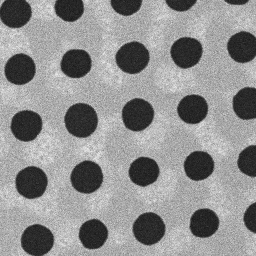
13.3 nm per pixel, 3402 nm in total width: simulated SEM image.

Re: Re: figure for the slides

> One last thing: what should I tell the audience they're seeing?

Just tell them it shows a regular array of holes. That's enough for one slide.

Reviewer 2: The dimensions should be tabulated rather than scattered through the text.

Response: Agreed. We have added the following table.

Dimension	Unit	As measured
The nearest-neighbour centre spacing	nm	735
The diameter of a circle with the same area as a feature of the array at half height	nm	422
